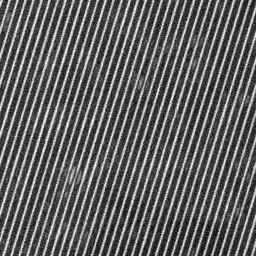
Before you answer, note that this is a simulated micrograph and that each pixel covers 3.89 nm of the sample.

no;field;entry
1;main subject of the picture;parallel lines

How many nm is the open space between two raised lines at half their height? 23.3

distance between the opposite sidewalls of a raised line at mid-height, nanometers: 5.2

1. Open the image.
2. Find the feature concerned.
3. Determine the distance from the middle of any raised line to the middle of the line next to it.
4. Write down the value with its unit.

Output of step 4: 29.9 nanometers